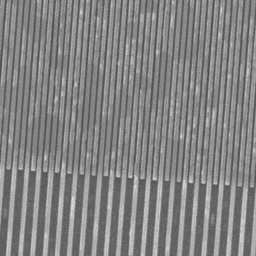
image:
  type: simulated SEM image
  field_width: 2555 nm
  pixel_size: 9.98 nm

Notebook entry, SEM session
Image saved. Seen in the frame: parallel lines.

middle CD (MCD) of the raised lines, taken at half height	37.3	nm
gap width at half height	18.7	nm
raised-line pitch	60.9	nm